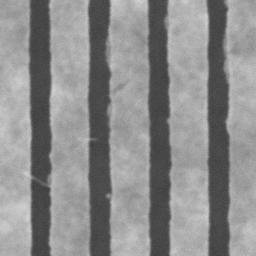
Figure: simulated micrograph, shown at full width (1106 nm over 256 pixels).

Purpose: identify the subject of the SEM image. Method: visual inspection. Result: lines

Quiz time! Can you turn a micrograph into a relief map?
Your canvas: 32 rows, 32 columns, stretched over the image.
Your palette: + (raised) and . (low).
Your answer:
++++..+++++...++++...+++++...+++
++++..+++++...++++...+++++..++++
++++..+++++...++++...+++++..++++
++++..+++++...++++...+++++..++++
++++..+++++...++++...+++++..++++
++++..+++++...++++...+++++..++++
++++..+++++...++++...+++++..++++
++++..+++++...++++...+++++...+++
++++..+++++...+++++..+++++...+++
++++..+++++...+++++..+++++...+++
++++...++++...++++...+++++...+++
++++..+++++...++++...+++++...+++
++++..+++++...++++...+++++...+++
++++..+++++...++++...+++++...+++
++++..+++++...+++++..+++++...+++
++++..+++++...+++++..+++++..++++
++++..+++++...+++++..+++++...+++
++++...++++...+++++..+++++...+++
++++...++++...+++++..+++++...+++
++++..+++++...+++++..+++++...+++
++++..+++++...+++++..+++++...+++
++++...++++...+++++..+++++...+++
++++...++++...+++++..+++++...+++
++++..+++++...+++++..+++++...+++
++++..+++++...+++++..+++++...+++
++++..+++++...+++++..+++++...+++
++++..+++++...+++++..+++++...+++
++++..+++++...+++++..+++++...+++
++++..+++++...+++++..+++++...+++
++++..+++++...+++++..+++++...+++
++++..+++++...+++++..+++++...+++
++++..+++++...+++++..+++++...+++